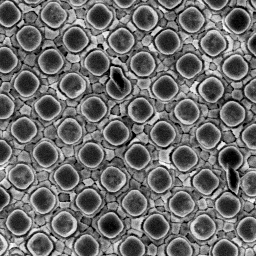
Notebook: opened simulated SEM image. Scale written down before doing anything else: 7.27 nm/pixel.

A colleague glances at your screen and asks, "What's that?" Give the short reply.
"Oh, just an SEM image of a regular array of raised bodies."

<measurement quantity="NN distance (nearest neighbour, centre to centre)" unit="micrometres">0.232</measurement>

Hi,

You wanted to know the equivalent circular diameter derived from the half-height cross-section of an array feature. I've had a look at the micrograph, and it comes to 177 nm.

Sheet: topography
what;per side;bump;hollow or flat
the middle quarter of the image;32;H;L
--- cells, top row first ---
LLLLLHHHHHHLLLLLLHHHHHHLLLLLHHHH
LLLLLLHHHHHLHHLLLHHHHHLLLLLLHHHH
LHHLLLLHHHLLHHHLLLHHHHLLLLLLLHHH
HHHHHLLLLLLLHHHLLLLLLLLLHHHLLLLL
HHHHHLLLLLLHHHHHLLLHHLLHHHHHLLLL
HHHHHLLLLLLHHHHHHLLHHLHHHHHHLLLL
HHHHHLLLLLLHHHHHHLLLLLHHHHHHLLLL
LHHHLLLLLLLHHHHHLLLLLLLHHHHHLLLL
LLLLLLHHHLLLHHHLLLLHLLLLHHHLLLLL
LLLLLHHHHHLLLLLLLHHHHLLLLLLLLHHH
LLLLLHHHHHLLLLLLHHHHHHLLLLLLHHHH
LLLLHHHHHHHLLLLLHHHHHHLLLLLLHHHH
LLLLLHHHHHLLLLLLHHHHHHLLLLLLHHHH
LLLLLLHHHHLLLLLLLHHHHLHLLLLLHHHH
HHHLLLLLLLLLHHLLLLLHLLHLHHLLLHHH
HHHHLLLLLLLHHHHLLLLLLLLHHHHLLLLL
HHHHLLLLLLHHHHHHLLHLLLHHHHHLLLLL
HHHHLLLLLLHHHHHHLLLLLLHHHHHHLLLL
HHHHLLLLLLHHHHHHLLLHLLHHHHHHLLLL
HHHLLLLLLLLHHHHLLLLLLLLHHHHLLLLL
LLLLLHHHHLLLLLLLLHHHLLLLHHLLLLLL
LLLLHHHHHHLLLLLLHHHHHLLLLLHLHHHH
LLLLHHHHHHLLLLLHHHHHHLLLHHLHHHHH
LLLLHHHHHHLLLLLHHHHHHLLLLHLHHHHH
LLLLHHHHHLLLLLLLHHHHHLLLLHLHHHHH
HHLLLLHHLLLLLLLLLHHHLLLLLLLLHHHH
HHHLLLLLLLHHHHLLLLLLLLLHHHLLLHHL
HHHLLLLLLLHHHHHLLLLLLHHHHHLLLLLL
HHHHLLLLLHHHHHHLLLLLLHHHHHHLLLLL
HHHHLLHLLHHHHHHLLLLLLHHHHHHLLLLL
HHHLLLLLLLHHHHHLLLLLLHHHHHHLLLLL
HLLLLHHLLLLHHHLLLLLLLLHHHLLLLLLL